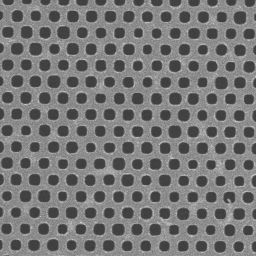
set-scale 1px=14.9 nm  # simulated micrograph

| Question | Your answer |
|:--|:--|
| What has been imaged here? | a regular array of holes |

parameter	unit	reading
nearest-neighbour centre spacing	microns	0.272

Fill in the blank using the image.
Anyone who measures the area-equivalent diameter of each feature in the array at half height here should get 0.172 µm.